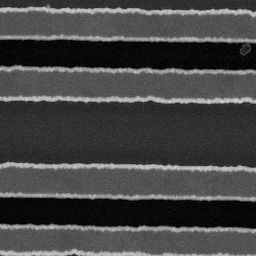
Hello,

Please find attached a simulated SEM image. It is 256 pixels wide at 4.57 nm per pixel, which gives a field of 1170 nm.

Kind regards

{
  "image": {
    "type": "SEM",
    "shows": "lines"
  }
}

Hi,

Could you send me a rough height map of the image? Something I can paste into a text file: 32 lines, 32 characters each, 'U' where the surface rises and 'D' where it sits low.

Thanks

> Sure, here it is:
DDDDDDDDDDDDDDDDDDDDDDDDDDDDDDDD
UUUUUUUUUUUUUUUUUUUUUUUUUUUUUUUU
UUUUUUUUUUUUUUUUUUUUUUUUUUUUUUUU
UUUUUUUUUUUUUUUUUUUUUUUUUUUUUUUU
UUUUUUUUUUUUUUUUUUUUUUUUUUUUUUUU
DDDDDDDDDDDDDDDDDDDDDDDDDDDDDDDD
DDDDDDDDDDDDDDDDDDDDDDDDDDDDDDDD
DDDDDDDDDDDDDDDDDDDDDDDDDDDDDDDD
UUUUUUUUUUUUUUDDDDDDDDDDDDDDDDDD
UUUUUUUUUUUUUUUUUUUUUUUUUUUUUUUU
UUUUUUUUUUUUUUUUUUUUUUUUUUUUUUUU
UUUUUUUUUUUUUUUUUUUUUUUUUUUUUUUU
UUUUUUUUUUUUUUUUUUUUUUUUUUUUUUUU
DDDDDDDDDDDDDDDDDDDDDDDDDDDDDDDD
DDDDDDDDDDDDDDDDDDDDDDDDDDDDDDDD
DDDDDDDDDDDDDDDDDDDDDDDDDDDDDDDD
DDDDDDDDDDDDDDDDDDDDDDDDDDDDDDDD
DDDDDDDDDDDDDDDDDDDDDDDDDDDDDDDD
DDDDDDDDDDDDDDDDDDDDDDDDDDDDDDDD
DDDDDDDDDDDDDDDDDDDDDDDDDDDDDDDD
UUUUDDDDUUUUUDUDDDDDDDDDDDDDDDDD
UUUUUUUUUUUUUUUUUUUUUUUUUUUUUUUU
UUUUUUUUUUUUUUUUUUUUUUUUUUUUUUUU
UUUUUUUUUUUUUUUUUUUUUUUUUUUUUUUU
UUUUUUUUUUUUUUUUUUUUUUUUUUUUUUUU
DDDDDDDDDDDDDDDDDDDDDDDDDDDDDDDD
DDDDDDDDDDDDDDDDDDDDDDDDDDDDDDDD
DDDDDDDDDDDDDDDDDDDDDDDDDDDDDDDD
UUUUUUUUUUUUUUUUUUUUUUUUUUUUUUDD
UUUUUUUUUUUUUUUUUUUUUUUUUUUUUUUU
UUUUUUUUUUUUUUUUUUUUUUUUUUUUUUUU
UUUUUUUUUUUUUUUUUUUUUUUUUUUUUUUU